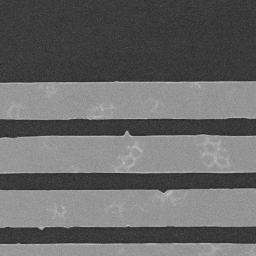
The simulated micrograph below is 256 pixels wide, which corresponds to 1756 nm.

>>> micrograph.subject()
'parallel lines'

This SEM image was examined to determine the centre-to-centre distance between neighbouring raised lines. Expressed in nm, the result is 370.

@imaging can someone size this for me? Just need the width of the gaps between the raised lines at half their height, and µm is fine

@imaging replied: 0.116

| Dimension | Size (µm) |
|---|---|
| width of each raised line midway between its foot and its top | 0.254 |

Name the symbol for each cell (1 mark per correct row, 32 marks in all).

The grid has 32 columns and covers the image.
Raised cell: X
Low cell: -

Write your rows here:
--------------------------------
--------------------------------
--------------------------------
--------------------------------
--------------------------------
--------------------------------
--------------------------------
--------------------------------
--------------------------------
--------------------------------
XXXXXXXXXXXXXXXXXXXXXXXXXXXXXXXX
XXXXXXXXXXXXXXXXXXXXXXXXXXXXXXXX
XXXXXXXXXXXXXXXXXXXXXXXXXXXXXXXX
XXXXXXXXXXXXXXXXXXXXXXXXXXXXXXXX
XXXXXXXXXXXXXXXXXXXXXXXXXXXXXXXX
--------------------------------
--------------------------------
XXXXXXXXXXXXXXXXXXXXXXXXXXXXXXXX
XXXXXXXXXXXXXXXXXXXXXXXXXXXXXXXX
XXXXXXXXXXXXXXXXXXXXXXXXXXXXXXXX
XXXXXXXXXXXXXXXXXXXXXXXXXXXXXXXX
XXXXXXX--XXXXXXXXXXXXXXXXXXXXX--
--------------------------------
--------------------------------
XXXXXXXXXXXXXXXXXXXXXXXXXXXXXXXX
XXXXXXXXXXXXXXXXXXXXXXXXXXXXXXXX
XXXXXXXXXXXXXXXXXXXXXXXXXXXXXXXX
XXXXXXXXXXXXXXXXXXXXXXXXXXXXXXXX
-----X--------------------------
--------------------------------
--X----XXXXX---------XXXXXXXXX--
XXXXXXXXXXXXXXXXXXXXXXXXXXXXXXXX